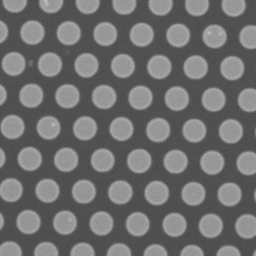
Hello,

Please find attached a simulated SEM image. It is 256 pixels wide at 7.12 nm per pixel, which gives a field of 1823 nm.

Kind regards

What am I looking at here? an array of small figures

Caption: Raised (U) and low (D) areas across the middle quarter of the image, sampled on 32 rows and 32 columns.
DDDUUUUUDDDDUUUUUUDDDUUUUUUDDDUU
DDDUUUUUDDDDUUUUUDDDDUUUUUUDDDUU
DDDDUUUUDDDDDUUUUDDDDDUUUUDDDDUU
DDDDDDDDDDDDDDDDDDDDDDDUUDDDDDDD
DDDDDDDDDDDDDDDDDDDDDDDDDDDDDDDD
UUDDDDDDDUUDDDDDDDDDDDDDDDDDDDDD
UUUDDDDDUUUUDDDDDUUUUDDDDDUUUUDD
UUUUDDDUUUUUUDDDUUUUUUDDDUUUUUUD
UUUUDDDUUUUUUDDDUUUUUUDDDUUUUUUD
UUUDDDDUUUUUUDDDUUUUUUDDDUUUUUUD
UUDDDDDDUUUUDDDDDUUUUDDDDDUUUUUD
DDDDDDDDDDDDDDDDDDDDDDDDDDDDUDDD
DDDDDDDDDDDDDDDDDDDDDDDDDDDDDDDD
DDDDUUUDDDDDDDUDDDDDDDDDDDDDDDDD
DDDUUUUUDDDDUUUUUDDDDUUUUUDDDDDU
DDUUUUUUDDDDUUUUUDDDDUUUUUDDDDUU
DDUUUUUUDDDUUUUUUDDDDUUUUUDDDDUU
DDDUUUUUDDDDUUUUUDDDDUUUUUDDDDUU
DDDDUUUDDDDDDUUUDDDDDUUUUUDDDDUU
DDDDDDDDDDDDDDDDDDDDDDDDDDDDDDDD
DDDDDDDDDDDDDDDDDDDDDDDDDDDDDDDD
UUDDDDDDUUUDDDDDDDUUDDDDDDDDDDDD
UUUDDDDUUUUUDDDDUUUUUDDDDDUUUUDD
UUUDDDDUUUUUDDDDUUUUUUDDDUUUUUUD
UUUDDDDUUUUUDDDDUUUUUUDDDUUUUUUD
UUUDDDDUUUUUDDDDUUUUUDDDDUUUUUUD
UUDDDDDDUUUDDDDDDUUUUDDDDDUUUUDD
DDDDDDDDDDDDDDDDDDDDDDDDDDDDDDDD
DDDDDDDDDDDDDDDDDDDDDDDDDDDDDDDD
DDDUUUUDDDDDDUUDDDDDDDUUDDDDDDDD
DDUUUUUDDDDDUUUUDDDDDUUUUUDDDDUU
DDUUUUUUDDDUUUUUUDDDUUUUUUDDDDUU